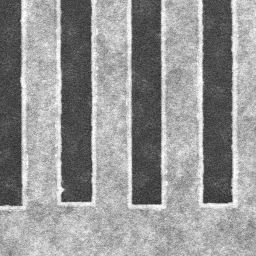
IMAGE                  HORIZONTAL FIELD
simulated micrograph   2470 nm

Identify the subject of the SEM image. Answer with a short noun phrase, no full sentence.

one or a few lines or trenches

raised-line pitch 679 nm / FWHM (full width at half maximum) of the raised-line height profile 346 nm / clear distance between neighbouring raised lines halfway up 0.329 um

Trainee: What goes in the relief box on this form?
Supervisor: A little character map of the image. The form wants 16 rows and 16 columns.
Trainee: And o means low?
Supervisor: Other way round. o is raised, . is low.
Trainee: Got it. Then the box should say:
..oo..oo..ooo..o
.ooo..oo..ooo..o
..oo..oo..ooo..o
.ooo..oo..ooo..o
.ooo..oo..ooo..o
.ooo..oo..ooo..o
..oo..oo..ooo..o
..oo..oo..ooo..o
.ooo..oo..ooo..o
..oo..oo..ooo..o
..oo..oo..ooo..o
.ooo..oo..ooo..o
.ooo..oo..ooo..o
oooooooooooooooo
oooooooooooooooo
oooooooooooooooo